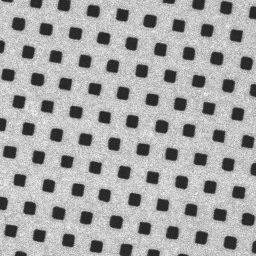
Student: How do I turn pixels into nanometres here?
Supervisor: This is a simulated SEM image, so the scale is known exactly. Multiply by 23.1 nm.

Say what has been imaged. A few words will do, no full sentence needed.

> a regular array of holes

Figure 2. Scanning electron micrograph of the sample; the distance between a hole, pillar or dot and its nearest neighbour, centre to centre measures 662 nanometers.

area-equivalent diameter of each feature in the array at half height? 320 nanometres